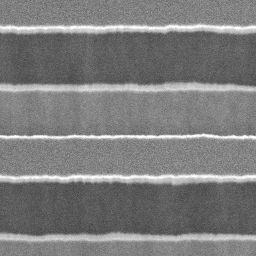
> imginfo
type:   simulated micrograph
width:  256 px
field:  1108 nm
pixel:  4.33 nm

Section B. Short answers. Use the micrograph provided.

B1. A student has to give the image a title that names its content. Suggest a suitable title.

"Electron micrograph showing lines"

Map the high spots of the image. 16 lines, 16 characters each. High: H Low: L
HHHHHHHHHHHHHHHH
HHHHHHHHHHHHHHHH
LLLLLLLLLLLLLLLL
LLLLLLLLLLLLLLLL
LLLLLLLLLLLLLLLL
LLLLLLLLLLLLLLLL
HHHHHHHHHHHHHHHH
HHHHHHHHHHHHHHHH
HHHHHHHHHHHHHHHH
HHHHHHHHHHHHHHHH
HHHHHHHHHHHHHHHH
LLLLLLLLLLLLLLLL
LLLLLLLLLLLLLLLL
LLLLLLLLLLLLLLLL
LLLLLLLLLLLLLLLL
HHHHHHHHHHHHHHHH